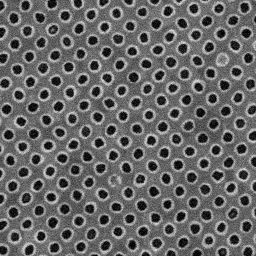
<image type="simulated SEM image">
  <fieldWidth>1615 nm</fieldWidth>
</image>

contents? a regular array of holes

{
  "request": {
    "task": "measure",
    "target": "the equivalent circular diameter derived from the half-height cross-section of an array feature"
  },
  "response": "67.9 nm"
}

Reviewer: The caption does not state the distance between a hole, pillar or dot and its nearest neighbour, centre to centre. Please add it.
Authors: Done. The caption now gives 0.112 µm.